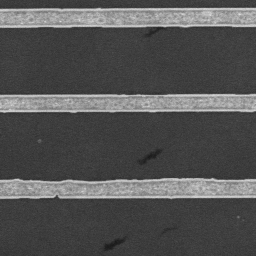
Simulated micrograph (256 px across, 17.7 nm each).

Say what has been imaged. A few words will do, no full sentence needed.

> one or a few lines or trenches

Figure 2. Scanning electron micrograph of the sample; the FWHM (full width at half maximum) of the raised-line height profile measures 289 nm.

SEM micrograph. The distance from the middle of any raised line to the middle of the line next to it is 1510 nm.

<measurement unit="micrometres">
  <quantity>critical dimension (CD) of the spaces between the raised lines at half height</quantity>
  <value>1.23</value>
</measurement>